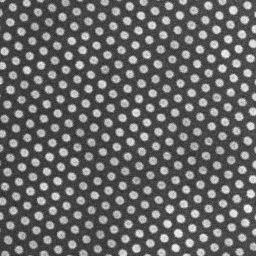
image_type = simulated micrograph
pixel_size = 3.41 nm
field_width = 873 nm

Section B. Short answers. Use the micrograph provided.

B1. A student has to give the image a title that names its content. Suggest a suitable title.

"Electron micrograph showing a regular array of raised bodies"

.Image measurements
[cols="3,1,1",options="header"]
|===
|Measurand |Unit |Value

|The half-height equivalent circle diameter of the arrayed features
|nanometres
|26.4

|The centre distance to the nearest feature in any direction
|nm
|49.2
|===